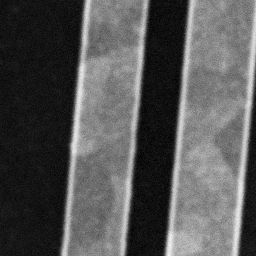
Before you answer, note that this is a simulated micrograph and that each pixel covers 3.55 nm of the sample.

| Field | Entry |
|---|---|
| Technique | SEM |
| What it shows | one or a few lines or trenches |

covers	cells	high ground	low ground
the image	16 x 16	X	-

-----XXXX---XXXX
-----XXXX---XXXX
-----XXXX---XXXX
-----XXXX---XXXX
-----XXXX---XXXX
-----XXXX--XXXXX
-----XXXX--XXXXX
-----XXX---XXXX-
-----XXX---XXXX-
-----XXX---XXXX-
-----XXX---XXXX-
----XXXX---XXXX-
----XXXX---XXXX-
----XXXX---XXXX-
----XXXX---XXXX-
----XXXX---XXXX-